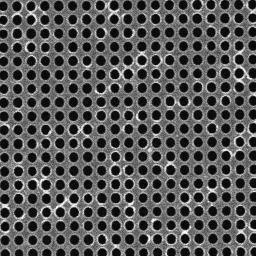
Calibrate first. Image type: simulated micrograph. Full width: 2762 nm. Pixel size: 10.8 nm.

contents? a regular array of holes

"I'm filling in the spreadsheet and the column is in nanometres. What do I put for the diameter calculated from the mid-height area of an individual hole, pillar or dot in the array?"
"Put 102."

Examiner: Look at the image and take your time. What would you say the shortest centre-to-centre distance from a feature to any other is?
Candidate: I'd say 146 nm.